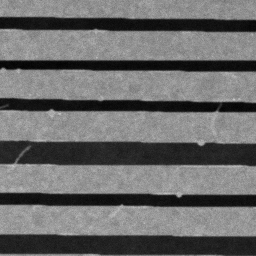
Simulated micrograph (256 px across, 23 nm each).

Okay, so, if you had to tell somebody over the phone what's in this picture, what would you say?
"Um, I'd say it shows lines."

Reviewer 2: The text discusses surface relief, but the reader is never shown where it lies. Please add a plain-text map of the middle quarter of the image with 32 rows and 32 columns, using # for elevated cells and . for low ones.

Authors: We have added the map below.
................................
................................
################################
################################
################################
################################
################################
################################
################################
................................
................................
................................
################################
################################
################################
################################
################################
################################
################################
................................
................................
................................
................................
................................
................................
................................
################################
################################
################################
################################
################################
################################